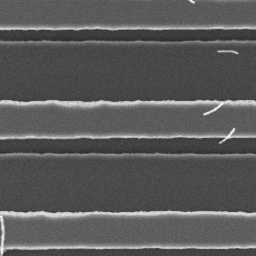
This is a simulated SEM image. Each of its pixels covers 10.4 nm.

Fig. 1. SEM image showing lines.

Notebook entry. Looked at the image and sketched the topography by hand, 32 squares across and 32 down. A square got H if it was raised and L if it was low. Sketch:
HHHHHHHHHHHHHHHHHHHHHHHHHHHHHHHH
HHHHHHHHHHHHHHHHHHHHHHHHHHHHHHHH
HHHHHHHHHHHHHHHHHHHHHHHHHHHHHHHH
HHHHHHHHHHHHHHHHHHHHHHHHHHHHHHHH
LLLLLLLLLLLLLLLLLLLLLLLLLLLLLLLL
LLLLLLLLLLLLLLLLLLLLLLLLLLLLLLLL
LLLLLLLLLLLLLLLLLLLLLLLLLLLLLLLL
LLLLLLLLLLLLLLLLLLLLLLLLLLLLLLLL
LLLLLLLLLLLLLLLLLLLLLLLLLLLLLLLL
LLLLLLLLLLLLLLLLLLLLLLLLLLLLLLLL
LLLLLLLLLLLLLLLLLLLLLLLLLLLLLLLL
LLLLLLLLLLLLLLLLLLLLLLLLLLLLLLLL
LLLLLLLLLLLLLLLLLLLLLLLLLLLLLLLL
HHHHHHHHHHHHHHHHHHHHHHHHHHHHHHHH
HHHHHHHHHHHHHHHHHHHHHHHHHHHHHHHH
HHHHHHHHHHHHHHHHHHHHHHHHHHHHHHHH
HHHHHHHHHHHHHHHHHHHHHHHHHHHHHHHH
LLLLLLLLLLLLLLLLLLLLLLLLLLLLLLLL
LLLLLLLLLLLLLLLLLLLLLLLLLLLLLLLL
LLLLLLLLLLLLLLLLLLLLLLLLLLLLLLLL
LLLLLLLLLLLLLLLLLLLLLLLLLLLLLLLL
LLLLLLLLLLLLLLLLLLLLLLLLLLLLLLLL
LLLLLLLLLLLLLLLLLLLLLLLLLLLLLLLL
LLLLLLLLLLLLLLLLLLLLLLLLLLLLLLLL
LLLLLLLLLLLLLLLLLLLLLLLLLLLLLLLL
LLLLLLLLLLLLLLLLLLLLLLLLLLLLLLLL
HLLLLHLLLLLLHLLLLHHHHHHLLHHLLLLL
HHHHHHHHHHHHHHHHHHHHHHHHHHHHHHHH
HHHHHHHHHHHHHHHHHHHHHHHHHHHHHHHH
HHHHHHHHHHHHHHHHHHHHHHHHHHHHHHHH
HHHHHHHHHHHHHHHHHHHHHHHHHHHHHHHH
LLLLLLLLLLLLLLLLLLLLLLLLLLLLLLLL